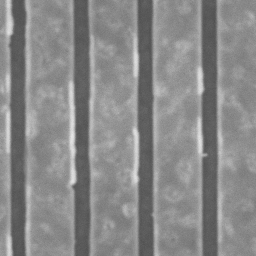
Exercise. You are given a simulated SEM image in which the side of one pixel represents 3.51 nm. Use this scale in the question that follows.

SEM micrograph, one or a few lines or trenches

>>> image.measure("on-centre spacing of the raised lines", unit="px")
63.8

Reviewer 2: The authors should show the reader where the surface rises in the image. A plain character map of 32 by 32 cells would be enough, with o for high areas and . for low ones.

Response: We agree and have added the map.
o..oooooo..oooooo..oooooo..ooooo
o..oooooo..oooooo..oooooo..ooooo
oo.oooooo..oooooo..oooooo..ooooo
oo.oooooo..oooooo..oooooo..ooooo
o..oooooo..oooooo..oooooo..ooooo
o..oooooo..oooooo..oooooo..ooooo
o..oooooo..oooooo..oooooo..ooooo
o..oooooo..oooooo..oooooo..ooooo
o..oooooo..oooooo..oooooo..ooooo
o..oooooo..oooooo..oooooo..ooooo
o..oooooo..oooooo..oooooo..ooooo
o..oooooo..oooooo..oooooo..ooooo
o..oooooo..oooooo..oooooo..ooooo
o..oooooo..oooooo..oooooo..ooooo
o..oooooo..oooooo..oooooo..ooooo
o..oooooo..oooooo..oooooo..ooooo
o..oooooo..oooooo..oooooo..ooooo
o..oooooo..oooooo..oooooo..ooooo
o..oooooo..oooooo..oooooo..ooooo
o..oooooo..oooooo..oooooo..ooooo
o..oooooo..oooooo..oooooo..ooooo
o..oooooo..oooooo..oooooo..ooooo
o..oooooo..oooooo..oooooo..ooooo
o..oooooo..oooooo..oooooo..ooooo
o..oooooo..oooooo..oooooo..ooooo
o..oooooo..oooooo..oooooo..ooooo
o..oooooo..oooooo..oooooo..ooooo
o..oooooo..oooooo..oooooo..ooooo
o..oooooo..oooooo..oooooo..ooooo
o..oooooo..oooooo..oooooo..ooooo
o..oooooo..oooooo..oooooo..ooooo
oo.oooooo..oooooo..oooooo..ooooo